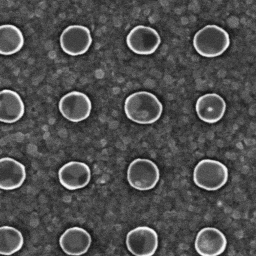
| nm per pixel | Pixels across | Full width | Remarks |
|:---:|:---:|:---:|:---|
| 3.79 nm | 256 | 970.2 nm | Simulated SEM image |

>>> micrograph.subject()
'a regular array of raised bodies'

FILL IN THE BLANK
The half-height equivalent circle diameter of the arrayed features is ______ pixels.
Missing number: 29.6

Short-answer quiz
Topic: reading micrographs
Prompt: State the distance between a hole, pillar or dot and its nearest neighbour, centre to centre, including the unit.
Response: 253 nm